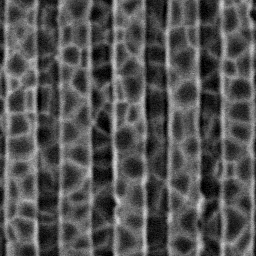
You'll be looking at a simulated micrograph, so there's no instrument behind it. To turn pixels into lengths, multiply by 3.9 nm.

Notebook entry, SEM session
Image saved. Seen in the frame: parallel lines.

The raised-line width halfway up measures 125 nm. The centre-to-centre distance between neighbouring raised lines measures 210 nm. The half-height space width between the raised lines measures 84.3 nm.